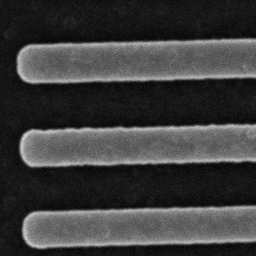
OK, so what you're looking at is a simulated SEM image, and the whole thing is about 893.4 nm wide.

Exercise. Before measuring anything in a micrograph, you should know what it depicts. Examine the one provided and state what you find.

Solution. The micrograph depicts one or a few lines or trenches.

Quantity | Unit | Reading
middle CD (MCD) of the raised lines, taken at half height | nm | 126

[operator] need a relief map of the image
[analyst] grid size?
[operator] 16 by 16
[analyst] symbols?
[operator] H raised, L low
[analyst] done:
LLLLLLLLLLLLLLLL
LLLLLLLLLLLLLLLL
LLLLLLLLLLLLLLHH
LHHHHHHHHHHHHHHH
LHHHHHHHHHHHHHHH
LLLLLLLLLLLLLLLL
LLLLLLLLLLLLLLLL
LLLLLLLLLLLLLLLL
LLHHHHHHHHHHHHHH
LHHHHHHHHHHHHHHH
LLLLLLLLLLLLLLLL
LLLLLLLLLLLLLLLL
LLLLLLLLLLLLLLLL
LLHHHHHHHHHHHHHH
LHHHHHHHHHHHHHHH
LLLLLLLLLLLLLLLL